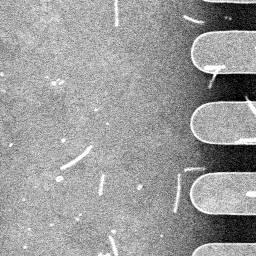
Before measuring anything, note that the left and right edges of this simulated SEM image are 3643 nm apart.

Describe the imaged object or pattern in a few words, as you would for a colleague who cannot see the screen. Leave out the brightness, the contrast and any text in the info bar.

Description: groups of lines, slits or small figures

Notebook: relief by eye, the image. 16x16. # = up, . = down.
................
................
............####
............####
.............###
................
.............###
............####
............####
................
................
............####
............####
................
................
............####